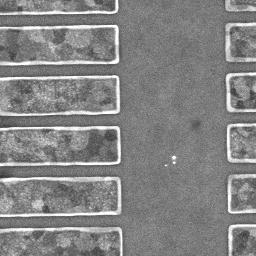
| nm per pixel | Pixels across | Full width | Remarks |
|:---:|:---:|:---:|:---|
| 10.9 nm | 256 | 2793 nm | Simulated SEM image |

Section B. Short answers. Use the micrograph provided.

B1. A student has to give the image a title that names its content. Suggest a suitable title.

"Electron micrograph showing wiring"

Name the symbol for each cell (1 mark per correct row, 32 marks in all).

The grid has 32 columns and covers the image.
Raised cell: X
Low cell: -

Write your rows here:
XXXXXXXXXXXXXXX--------------XXX
XXXXXXXXXXX---------------------
--------------------------------
X------XXXXXXX---------------XXX
XXXXXXXXXXXXXXX--------------XXX
XXXXXXXXXXXXXXX--------------XXX
XXXXXXXXXXXXXXX--------------XXX
XXXXXXXXXXXXXX------------------
--------------------------------
-----------------------------XXX
XXXXXXXXXXXXXXX--------------XXX
XXXXXXXXXXXXXXX--------------XXX
XXXXXXXXXXXXXXX--------------XXX
XXXXXXXXXXXXXXX--------------XXX
--------------------------------
--------------------------------
XXXXXXXXXXXXXXX--------------XXX
XXXXXXXXXXXXXXX--------------XXX
XXXXXXXXXXXXXXX--------------XXX
XXXXXXXXXXXXXXX--------------XXX
X-------------------------------
--------------------------------
---XXXXXX--XXX---------------XXX
XXXXXXXXXXXXXXX--------------XXX
XXXXXXXXXXXXXXX--------------XXX
XXXXXXXXXXXXXXX--------------XXX
XXXXXXXXXXXXXXX-----------------
--------------------------------
-----------------------------XXX
XXXXXXXXXXXXXXX--------------XXX
XXXXXXXXXXXXXXX--------------XXX
XXXXXXXXXXXXXXX--------------XXX